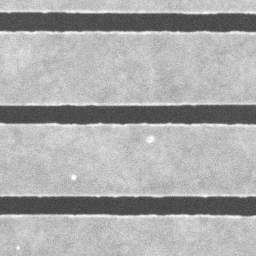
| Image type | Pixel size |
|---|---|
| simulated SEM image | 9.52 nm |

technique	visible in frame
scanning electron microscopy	lines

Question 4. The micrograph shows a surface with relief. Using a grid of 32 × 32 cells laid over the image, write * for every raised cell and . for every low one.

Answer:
********************************
.*...*..************************
................................
................................
********************************
********************************
********************************
********************************
********************************
********************************
********************************
********************************
********************************
................................
................................
*....**.....*....**..*...*......
********************************
********************************
********************************
********************************
********************************
********************************
********************************
********************************
*.*.***....**.*..*.**....*...**.
................................
................................
********************************
********************************
********************************
********************************
********************************